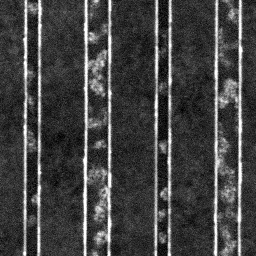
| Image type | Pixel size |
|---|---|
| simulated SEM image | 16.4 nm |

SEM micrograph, one or a few lines or trenches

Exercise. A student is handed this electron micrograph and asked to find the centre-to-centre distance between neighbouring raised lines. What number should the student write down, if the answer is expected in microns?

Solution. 1.07